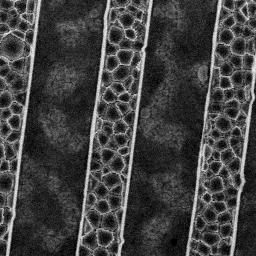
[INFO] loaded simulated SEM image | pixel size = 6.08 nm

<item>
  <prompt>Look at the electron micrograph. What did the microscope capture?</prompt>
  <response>one or a few lines or trenches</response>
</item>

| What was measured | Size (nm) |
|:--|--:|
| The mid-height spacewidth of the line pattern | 417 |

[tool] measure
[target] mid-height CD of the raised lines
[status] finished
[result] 0.256 micrometres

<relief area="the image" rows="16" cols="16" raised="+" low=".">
++.....++.....++
++.....++.....++
++.....++....+++
++....+++....+++
++....+++....+++
++....+++....+++
++....+++....+++
++....+++....+++
+.....++.....++.
+.....++.....++.
+.....++....+++.
+....+++....+++.
+....+++....+++.
+....+++....+++.
+....+++....+++.
+....+++....+++.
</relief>